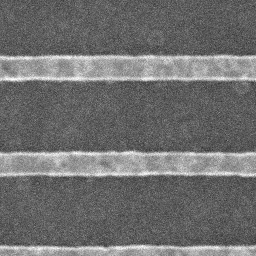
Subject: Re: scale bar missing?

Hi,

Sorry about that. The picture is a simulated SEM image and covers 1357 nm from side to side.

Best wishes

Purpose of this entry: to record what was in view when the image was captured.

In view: one or a few lines or trenches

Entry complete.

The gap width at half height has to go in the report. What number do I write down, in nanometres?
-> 392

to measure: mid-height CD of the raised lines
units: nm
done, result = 115